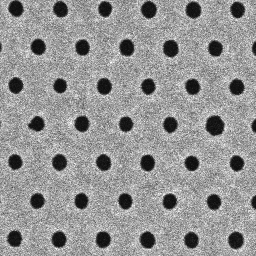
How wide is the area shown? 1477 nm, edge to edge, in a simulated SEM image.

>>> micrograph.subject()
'a regular array of holes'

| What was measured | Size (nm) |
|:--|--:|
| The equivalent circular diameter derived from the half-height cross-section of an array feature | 92.2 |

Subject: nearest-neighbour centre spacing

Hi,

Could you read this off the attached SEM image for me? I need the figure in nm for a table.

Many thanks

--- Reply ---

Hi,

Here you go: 254